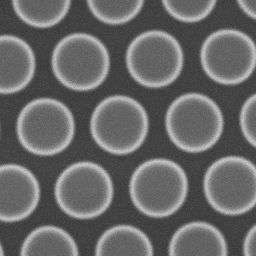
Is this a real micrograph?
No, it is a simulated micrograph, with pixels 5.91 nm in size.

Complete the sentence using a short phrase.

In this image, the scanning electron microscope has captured an array of small figures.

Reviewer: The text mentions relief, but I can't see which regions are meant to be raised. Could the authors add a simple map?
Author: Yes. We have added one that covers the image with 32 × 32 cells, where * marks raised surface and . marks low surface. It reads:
..*******..*******...******...**
..******....*****....*****.....*
...****......***.......**.......
................................
.........**.......***.....*****.
***....******...******....******
****...******...*******..*******
****...*******..*******..*******
****...*******..*******..*******
****...******....*****....*****.
***.....****......***...........
*...............................
.....*.......****.....****.....*
...*****....******...******...**
..*******...******...*******..**
..*******..*******...*******..**
..*******...******...*******..**
...******...******....*****....*
...*****.....****......***......
................................
..........**......****.....****.
****....*****....******...******
****...*******..*******...******
*****..*******..*******...******
*****..*******..*******...******
*****..*******...******...******
****....*****.....****......**..
**..............................
.....**.......***......****.....
....*****....*****....******...*
...******...*******..*******...*
...*******..*******..*******...*